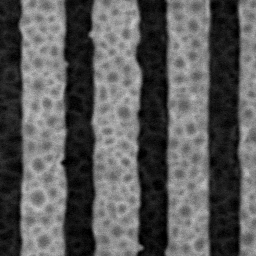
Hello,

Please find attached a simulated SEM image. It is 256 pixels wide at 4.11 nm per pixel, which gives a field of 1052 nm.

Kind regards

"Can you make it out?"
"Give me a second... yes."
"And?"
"one or a few lines or trenches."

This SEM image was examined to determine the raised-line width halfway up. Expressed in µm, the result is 0.176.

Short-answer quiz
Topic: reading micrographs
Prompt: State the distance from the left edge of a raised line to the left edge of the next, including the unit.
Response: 72.4 pixels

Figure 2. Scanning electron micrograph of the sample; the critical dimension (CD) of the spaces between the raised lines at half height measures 119 nm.